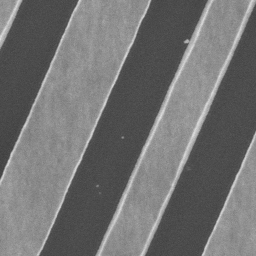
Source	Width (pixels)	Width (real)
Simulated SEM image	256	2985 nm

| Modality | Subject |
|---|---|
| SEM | lines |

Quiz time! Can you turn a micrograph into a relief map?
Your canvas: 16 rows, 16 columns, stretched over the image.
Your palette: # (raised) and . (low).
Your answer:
#....####....###
#...#####...###.
....####....###.
...#####....##..
...####....###..
...####....###..
..#####...###...
..####....###...
.#####...###....
.####....###...#
#####...###....#
####....###....#
####....###...##
####...###....##
###....###...###
###...###....###